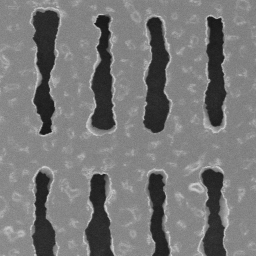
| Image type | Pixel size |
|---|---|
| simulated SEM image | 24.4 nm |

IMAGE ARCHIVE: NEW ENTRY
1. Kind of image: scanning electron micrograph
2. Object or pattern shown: holes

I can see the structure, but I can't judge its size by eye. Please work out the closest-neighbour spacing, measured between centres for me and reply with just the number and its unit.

1.37 um